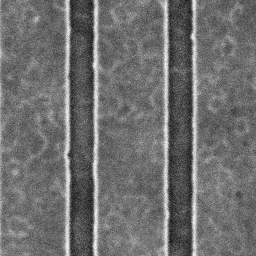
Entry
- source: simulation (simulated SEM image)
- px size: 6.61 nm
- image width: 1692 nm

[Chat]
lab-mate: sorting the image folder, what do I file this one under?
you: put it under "one or a few lines or trenches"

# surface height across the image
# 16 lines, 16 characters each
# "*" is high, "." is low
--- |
****..****..****
****..****..****
****..****..****
****..****..****
****..****..****
****..****..****
****..****..****
****..****..****
****..****..****
****..****..****
****..****..****
****..****..****
****..****..****
****..****..****
****..****..****
****..****..****